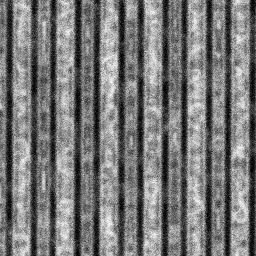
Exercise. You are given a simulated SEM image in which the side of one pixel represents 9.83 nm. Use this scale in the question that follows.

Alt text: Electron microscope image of parallel lines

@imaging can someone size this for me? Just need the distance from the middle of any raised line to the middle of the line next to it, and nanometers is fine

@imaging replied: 215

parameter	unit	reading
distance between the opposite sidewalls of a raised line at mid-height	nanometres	103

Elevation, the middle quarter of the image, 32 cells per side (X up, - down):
--XXX--XX----XXX--XX----XXX--XX-
--XXX--XX----XXX--XX----XXX--XX-
--XXX--XX----XXX--XX----XXX--XX-
--XXX--XX----XXX--XX----XXX--XX-
--XXX--XX----XXX--XX----XXX--XX-
--XXX--XX----XXX--XX----XXX--XX-
--XXX--XX----XXX--XX----XXX--XX-
--XXX--XX----XXX--XX----XXX--XX-
--XXX--XX--X-XXX--XX----XXX--XX-
--XXX--XX--X-XXX--XX----XXX--XX-
--XXX--XX----XXX--XX----XXX--XX-
--XXX--XX----XXX--XX----XXX--XX-
--XXX--XX----XXX--XX----XXX--XX-
--XXX--XX----XXX--XX----XXX--XX-
--XXX--XX----XXX--XX----XXX--XX-
--XXX--XX----XXX--XX----XXX--XX-
--XXX--XX----XXX--XX----XXX--XX-
--XXX--XX----XXX--XX----XXX--XX-
--XXX--XX----XXX--XX----XXX--XX-
--XXX--XX----XXX--XX----XXX--XX-
--XXX--XX----XXX--XX----XXX--XX-
--XXX--XX----XXX--XX----XXX--XX-
--XXX--XX-X--XXX--XX----XXX--XX-
--XXX--XX-XX-XXX--XX----XXX--XX-
--XXX--XX----XXX--XX----XX---XX-
--XXX--XX----XXX--XX----XX---XX-
--XXX--XX----XXX--XX----XX---XX-
--XXX--XX----XXX--XX----XX---XX-
--XXX--XX----XXX--XX----XX---XX-
--XXX--XX----XXX--XX----XX---XX-
--XXX--XX----XXX--XX----XX---XX-
--XXX--XX----XXX--XX----XX---XX-